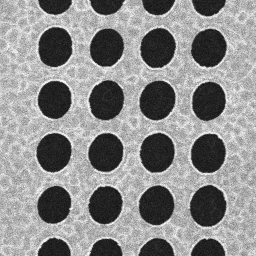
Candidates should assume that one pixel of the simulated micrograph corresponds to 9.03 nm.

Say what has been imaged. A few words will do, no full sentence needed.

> a regular array of holes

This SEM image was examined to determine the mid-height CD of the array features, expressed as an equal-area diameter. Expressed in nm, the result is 336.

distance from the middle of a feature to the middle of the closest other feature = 51.2 pixels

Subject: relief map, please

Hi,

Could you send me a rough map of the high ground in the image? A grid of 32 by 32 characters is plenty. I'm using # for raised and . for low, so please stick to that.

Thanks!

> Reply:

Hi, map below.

#####....##....###....##....####
######..####...###...####..#####
################################
######..########################
#####....###...###....##....####
#####....##....###....##....####
#####....##....###....##....####
#####...####...###...###....####
################################
################################
######..####...####..####..#####
#####....##....###....##....####
#####....##.....##....##....####
#####....##....##.....##....####
######..####...###...####..#####
################################
################################
#####....###...###...####...####
#####....##....###....##....####
#####....##....###....##....####
#####...###....###...###....####
######.############.#####..#####
################################
######..####..#####..####..#####
#####....##....###....##....####
#####....##....##.....##....####
#####....##....##.....##....####
#####...####..####...###....####
################################
################################
#####...####...###...###....####
#####....##....##.....##....####